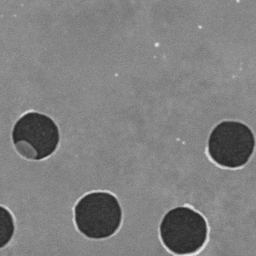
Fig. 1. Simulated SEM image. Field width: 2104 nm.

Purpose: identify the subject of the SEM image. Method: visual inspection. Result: holes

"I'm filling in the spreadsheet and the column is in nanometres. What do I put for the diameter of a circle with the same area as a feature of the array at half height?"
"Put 388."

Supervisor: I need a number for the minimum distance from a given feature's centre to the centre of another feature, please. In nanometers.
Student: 763